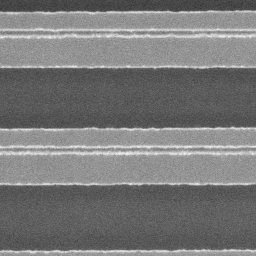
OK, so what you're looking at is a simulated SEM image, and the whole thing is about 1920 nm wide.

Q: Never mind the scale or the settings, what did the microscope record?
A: lines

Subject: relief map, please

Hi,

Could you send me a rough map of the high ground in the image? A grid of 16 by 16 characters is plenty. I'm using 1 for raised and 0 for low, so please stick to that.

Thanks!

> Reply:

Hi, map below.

0000000000000000
1111111111111111
1111111111111111
1111111111111111
0000000000000000
0000000000000000
0000000000000000
0000000000000000
1111111111111111
1111111111111111
1111111111111111
1111111110111111
0000000000000000
0000000000000000
0000000000000000
0000000000000000